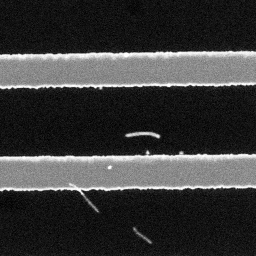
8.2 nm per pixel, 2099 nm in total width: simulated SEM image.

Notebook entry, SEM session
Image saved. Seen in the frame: lines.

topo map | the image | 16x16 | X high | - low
----------------
----------------
----------------
XXXXXXXXXXXXXXXX
XXXXXXXXXXXXXXXX
X---------------
----------------
----------------
----------------
----------------
XXXXXXXXXXXXXXXX
XXXXXXXXXXXXXXXX
----------------
----------------
----------------
----------------